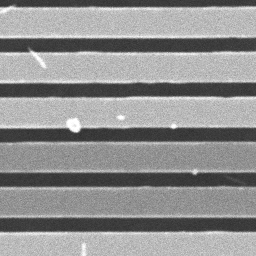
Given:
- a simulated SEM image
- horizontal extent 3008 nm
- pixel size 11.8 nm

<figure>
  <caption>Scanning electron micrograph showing lines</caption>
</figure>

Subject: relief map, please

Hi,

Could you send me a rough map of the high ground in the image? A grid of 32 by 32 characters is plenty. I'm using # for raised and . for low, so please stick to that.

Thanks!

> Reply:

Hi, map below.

................................
################################
################################
################################
################################
................................
................................
################################
################################
################################
................................
................................
################################
################################
################################
################################
................................
................................
################################
################################
################################
........................#.......
................................
################################
################################
################################
################################
................................
................................
################################
################################
################################